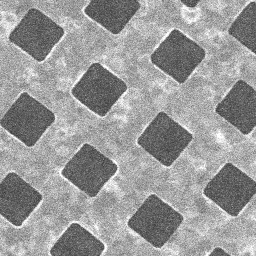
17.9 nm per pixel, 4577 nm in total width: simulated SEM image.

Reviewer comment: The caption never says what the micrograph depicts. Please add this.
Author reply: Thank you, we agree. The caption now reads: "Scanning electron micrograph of holes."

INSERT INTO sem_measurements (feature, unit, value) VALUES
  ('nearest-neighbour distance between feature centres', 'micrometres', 1.47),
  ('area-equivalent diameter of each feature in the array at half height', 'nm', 856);